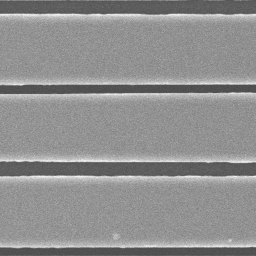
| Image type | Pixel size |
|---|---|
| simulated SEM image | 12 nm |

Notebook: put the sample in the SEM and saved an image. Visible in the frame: lines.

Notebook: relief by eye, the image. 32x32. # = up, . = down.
................................
................................
################################
################################
################################
################################
################################
################################
################################
################################
###..###........#...............
................................
################################
################################
################################
################################
################################
################################
################################
################################
................................
................................
################################
################################
################################
################################
################################
################################
################################
################################
################################
................................